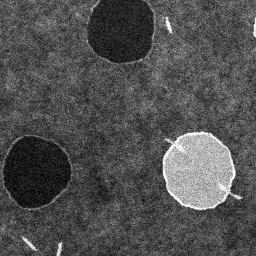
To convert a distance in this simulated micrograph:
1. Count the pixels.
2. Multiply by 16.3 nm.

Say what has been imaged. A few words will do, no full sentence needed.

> raised bodies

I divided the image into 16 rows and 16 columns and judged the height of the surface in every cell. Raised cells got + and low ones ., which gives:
......+++.......
.....+++++......
.....+++++......
......+++.......
................
................
................
................
...........++...
.+++......++++..
++++......+++++.
++++......++++..
.++........+++..
................
................
................